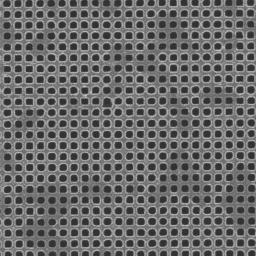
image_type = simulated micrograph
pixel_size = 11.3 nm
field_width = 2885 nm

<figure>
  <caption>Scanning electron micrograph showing a regular array of holes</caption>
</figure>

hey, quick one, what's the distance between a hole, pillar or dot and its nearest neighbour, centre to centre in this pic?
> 0.121 micrometres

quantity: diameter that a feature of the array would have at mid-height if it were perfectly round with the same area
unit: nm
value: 84.4